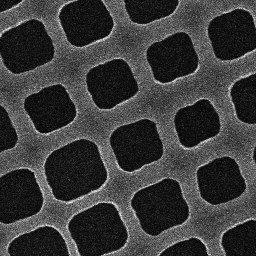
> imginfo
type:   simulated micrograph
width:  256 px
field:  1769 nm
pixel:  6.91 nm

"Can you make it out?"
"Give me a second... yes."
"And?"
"a regular array of holes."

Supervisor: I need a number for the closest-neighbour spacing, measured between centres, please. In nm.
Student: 454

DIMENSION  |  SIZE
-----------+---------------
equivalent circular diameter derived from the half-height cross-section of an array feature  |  341 nanometres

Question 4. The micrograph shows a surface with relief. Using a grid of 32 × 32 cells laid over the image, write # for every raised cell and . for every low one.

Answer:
..######.....###......##########
#######.......##......#######..#
####.##.......##....#######.....
##....##......############......
......##.....########...##......
.......##..########.....##......
.......###########......###....#
......########.###.......###.###
#....#######....###......#######
###########......##....########.
###########......############...
#####...###......############...
###......###....#########.###...
###......###..#########....##...
.###.....#############.....###..
..##.....#######...###.....####.
..###.########......##.....#####
..########.###......##....######
.######.....##......############
######.......#......############
######.......##...########....##
#...##.......############.....##
.....#.......#######..###......#
.....#......######.....##......#
.....##...#######......##.....##
.....#######..##.......###.#####
.....#####.....##.......########
..#######......##......#########
#####..##.......##...########...
##......#.......############....
#.......#.......######...###....
#........#....######......##....